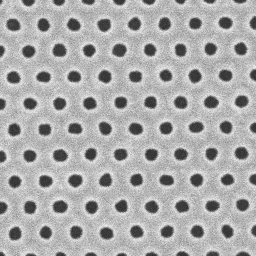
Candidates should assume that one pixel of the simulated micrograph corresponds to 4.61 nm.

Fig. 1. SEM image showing a regular array of holes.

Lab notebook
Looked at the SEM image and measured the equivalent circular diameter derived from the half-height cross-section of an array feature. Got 62 nm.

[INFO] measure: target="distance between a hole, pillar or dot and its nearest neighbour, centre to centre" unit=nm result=136